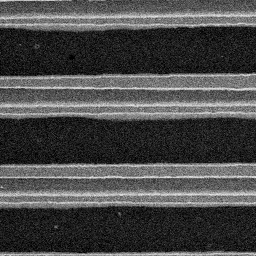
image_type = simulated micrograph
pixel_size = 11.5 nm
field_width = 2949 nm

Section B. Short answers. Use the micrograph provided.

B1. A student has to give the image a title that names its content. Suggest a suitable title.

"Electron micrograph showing lines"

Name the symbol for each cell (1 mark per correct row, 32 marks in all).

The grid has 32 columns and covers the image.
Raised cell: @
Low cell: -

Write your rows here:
@@@@@@@@@@@@@@@@@@@@@@@@@@@@@@@@
@@@@@@@@@@@@@@@@@@@@@@@@@@@@@@@@
@@@@@@@@@@@@@@@@@@@@@@@@@@@@@@@@
--------------------------------
--------------------------------
--------------------------------
--------------------------------
--------------------------------
--------------------------------
------------------@@@@@@@@@@@@@@
@@@@@@@@@@@@@@@@@@@@@@@@@@@@@@@@
@@@@@@@@@@@@@@@@@@@@@@@@@@@@@@@@
@@@@@@@@@@@@@@@@@@@@@@@@@@@@@@@@
@@@@@@@@@@@@@@@@@@@@@@@@@@@@@@@@
--------------------------------
--------------------------------
--------------------------------
--------------------------------
--------------------------------
--------------------------------
--------------------------------
@@@@@@@@@@@@@@@@@@@@@@@@@@@@@@@@
@@@@@@@@@@@@@@@@@@@@@@@@@@@@@@@@
@@@@@@@@@@@@@@@@@@@@@@@@@@@@@@@@
@@@@@@@@@@@@@@@@@@@@@@@@@@@@@@@@
--------------------------------
--------------------------------
--------------------------------
--------------------------------
--------------------------------
--------------------------------
--------------------------------